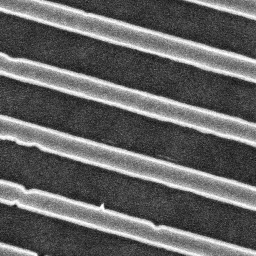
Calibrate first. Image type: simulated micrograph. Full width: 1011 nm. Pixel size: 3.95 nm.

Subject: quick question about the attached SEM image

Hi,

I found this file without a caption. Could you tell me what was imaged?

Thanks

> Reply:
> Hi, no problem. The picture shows one or a few lines or trenches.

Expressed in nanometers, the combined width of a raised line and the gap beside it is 242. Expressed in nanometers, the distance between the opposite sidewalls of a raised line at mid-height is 81.7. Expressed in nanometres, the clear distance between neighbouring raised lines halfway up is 160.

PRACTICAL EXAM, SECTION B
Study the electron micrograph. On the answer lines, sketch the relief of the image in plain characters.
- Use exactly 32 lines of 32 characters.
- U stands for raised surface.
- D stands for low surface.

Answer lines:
UUUUUUUDDDDDDDDDDDDDDDDDDUUUUUUU
DUUUUUUUUUDDDDDDDDDDDDDDDDDDDUUU
DDDDUUUUUUUUUUDDDDDDDDDDDDDDDDDD
DDDDDDDDUUUUUUUUUDDDDDDDDDDDDDDD
DDDDDDDDDDDUUUUUUUUUUDDDDDDDDDDD
DDDDDDDDDDDDDDDUUUUUUUUUUDDDDDDD
DDDDDDDDDDDDDDDDDDUUUUUUUUUUDDDD
UUUDDDDDDDDDDDDDDDDDDDUUUUUUUUUU
UUUUUUUDDDDDDDDDDDDDDDDDDDUUUUUU
DUUUUUUUUUDDDDDDDDDDDDDDDDDDDDUU
DDDDDUUUUUUUUUDDDDDDDDDDDDDDDDDD
DDDDDDDDUUUUUUUUUUDDDDDDDDDDDDDD
DDDDDDDDDDDDUUUUUUUUUDDDDDDDDDDD
DDDDDDDDDDDDDDDUUUUUUUUUUDDDDDDD
DDDDDDDDDDDDDDDDDDDUUUUUUUUUDDDD
UUUUDDDDDDDDDDDDDDDDDDDUUUUUUUUU
UUUUUUUDDDDDDDDDDDDDDDDDDDUUUUUU
DDUUUUUUUUDDDDDDDDDDDDDDDDDDDDUU
DDDDDUUUUUUUUUDDDDDDDDDDDDDDDDDD
DDDDDDDDUUUUUUUUUUDDDDDDDDDDDDDD
DDDDDDDDDDDDUUUUUUUUUDDDDDDDDDDD
DDDDDDDDDDDDDDDUUUUUUUUUUDDDDDDD
DDDDDDDDDDDDDDDDDDDUUUUUUUUUUDDD
UUUDDDDDDDDDDDDDDDDDDDUUUUUUUUUU
UUUUUUUDDDDDDDDDDDDDDDDDDDUUUUUU
DDUUUUUUUUUDDDDDDDDDDDDDDDDDDUUU
DDDDDUUUUUUUUUDDDDDDDDDDDDDDDDDD
DDDDDDDDDUUUUUUUUUDDDDDDDDDDDDDD
DDDDDDDDDDDDUUUUUUUUUDDDDDDDDDDD
DDDDDDDDDDDDDDDDUUUUUUUUUDDDDDDD
DDDDDDDDDDDDDDDDDDDUUUUUUUUUDDDD
UUUUDDDDDDDDDDDDDDDDDDDUUUUUUUUU